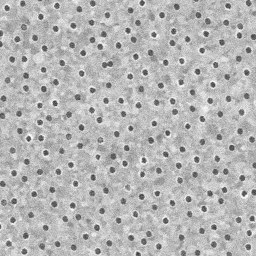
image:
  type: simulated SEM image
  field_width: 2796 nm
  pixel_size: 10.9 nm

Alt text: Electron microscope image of a regular array of holes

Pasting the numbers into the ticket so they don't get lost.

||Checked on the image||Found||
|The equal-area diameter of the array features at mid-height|71.9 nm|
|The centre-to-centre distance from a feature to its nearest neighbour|0.165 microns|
